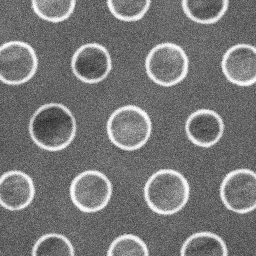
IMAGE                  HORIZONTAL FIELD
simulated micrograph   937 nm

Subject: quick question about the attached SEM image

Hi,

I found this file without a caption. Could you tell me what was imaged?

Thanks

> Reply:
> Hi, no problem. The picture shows raised bodies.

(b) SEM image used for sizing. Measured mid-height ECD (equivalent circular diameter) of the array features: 0.144 um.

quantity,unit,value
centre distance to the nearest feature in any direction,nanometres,271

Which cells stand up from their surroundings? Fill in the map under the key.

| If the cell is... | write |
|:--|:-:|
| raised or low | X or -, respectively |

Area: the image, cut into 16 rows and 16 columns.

--XX---XX---XX--
----------------
----------------
XX---XX--XX---XX
XX---XX--XXX--XX
----------------
----------------
--XXX--XX---XX--
--XXX--XX---XX--
----------------
----------------
XX---XX--XXX--XX
XX---XX--XXX--XX
----------------
----------------
--XX---XX--XXX--